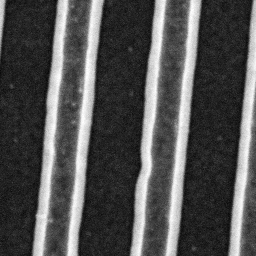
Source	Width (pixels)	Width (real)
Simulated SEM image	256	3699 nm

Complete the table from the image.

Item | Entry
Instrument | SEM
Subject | one or a few lines or trenches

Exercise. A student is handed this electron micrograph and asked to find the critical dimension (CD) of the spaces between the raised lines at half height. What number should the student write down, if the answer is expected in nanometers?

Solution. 915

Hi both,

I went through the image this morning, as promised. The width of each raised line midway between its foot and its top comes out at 493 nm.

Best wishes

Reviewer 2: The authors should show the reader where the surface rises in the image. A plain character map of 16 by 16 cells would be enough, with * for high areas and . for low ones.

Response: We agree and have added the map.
....**....**....
....**....**....
....**....**....
....**....**....
....**....**....
...***...***....
...**....***....
...**....**....*
...**....**....*
...**....**....*
...**....**....*
...**....**....*
...**....**....*
...**....**....*
...**....**....*
..***....**....*